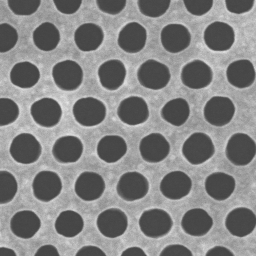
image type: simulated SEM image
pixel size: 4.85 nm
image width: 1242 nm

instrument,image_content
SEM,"a regular array of holes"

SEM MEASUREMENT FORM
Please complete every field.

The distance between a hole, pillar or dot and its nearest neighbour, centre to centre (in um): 0.205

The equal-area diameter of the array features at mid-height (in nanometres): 142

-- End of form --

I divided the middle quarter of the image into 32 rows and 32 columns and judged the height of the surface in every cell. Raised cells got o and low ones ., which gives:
....ooooo......oooo.......oooo..
....ooooo.......ooo.......oooo..
.....oooo.......ooo.......ooo...
....ooooo......oooo........oo...
....ooooo......oooo.......oooo..
....oooooo....oooooo......ooooo.
..oooooooooooooooooooooooooooooo
oooooooooooooooooooooooooooooooo
ooooo..ooooooooo...ooooooooooooo
ooo......ooooo......oooooo.....o
oo........oooo.......oooo......o
oo........oooo.......ooo.......o
oo........ooo........oooo......o
ooo.......oooo.......oooo......o
oooo.....oooooo.....oooooo....oo
ooooo..ooooooooooooooooooooo.ooo
oooooooooooooooooooooooooooooooo
oooooooooooooooooooooo..oooooooo
...ooooooo.....ooooo.....oooooo.
....ooooo......oooo.......oooo..
.....ooo........ooo.......oooo..
.....ooo........ooo.......oooo..
....oooo.......oooo.......oooo..
....ooooo.....oooooo.....ooooo..
..ooooooooo..ooooooooo.oooooooo.
oooooooooooooooooooooooooooooooo
oooooooooooooooooooooooooooooooo
oooo....ooooooo....ooooooo....oo
ooo.......oooo......ooooo.......
ooo.......ooo........ooo........
ooo.......ooo........ooo........
ooo.......ooo........ooo........